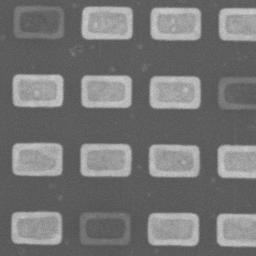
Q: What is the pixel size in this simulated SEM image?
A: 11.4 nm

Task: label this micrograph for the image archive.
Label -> wiring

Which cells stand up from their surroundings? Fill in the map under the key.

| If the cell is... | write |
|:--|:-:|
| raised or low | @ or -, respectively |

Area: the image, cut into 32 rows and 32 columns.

--------------------------------
--@@@@@----@@@@@----@@@@-----@--
--@@@@@----@@@@@---@@@@@@---@@@@
--@@@@@----@@@@@---@@@@@@---@@@@
------------@@@@----@@@@----@@@@
--------------------------------
--------------------------------
--------------------------------
--------------------------------
--------------------------------
--@@@@@----@@@@@---@@@@@@---@@@@
--@@@@@----@@@@@---@@@@@@---@@@@
--@@@@@----@@@@@---@@@@@@---@@@@
--------------------------------
--------------------------------
--------------------------------
--------------------------------
--------------------------------
--@@@@-----@@@@-----------------
--@@@@@----@@@@@---@@@@@----@@@@
--@@@@@---@@@@@@---@@@@@----@@@@
----@@-----@@@@----@@@@@----@@@@
--------------------------------
--------------------------------
--------------------------------
--------------------------------
--------------------------------
--@@@@@---@@@@@@---@@@@@----@@@@
--@@@@@---@@@@@@---@@@@@----@@@@
--@@@@@---@@@@@@---@@@@@----@@@@
--------------------------------
--------------------------------